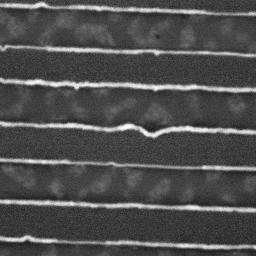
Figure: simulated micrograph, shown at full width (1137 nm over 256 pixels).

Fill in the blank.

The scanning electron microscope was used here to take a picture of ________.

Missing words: one or a few lines or trenches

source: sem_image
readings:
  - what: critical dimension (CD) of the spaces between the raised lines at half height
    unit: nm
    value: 175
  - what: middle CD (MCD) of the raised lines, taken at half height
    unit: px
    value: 39.4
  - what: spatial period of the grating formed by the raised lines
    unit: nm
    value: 346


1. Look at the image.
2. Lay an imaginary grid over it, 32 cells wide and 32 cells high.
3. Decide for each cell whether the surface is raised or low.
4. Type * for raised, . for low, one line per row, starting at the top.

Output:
********************************
......................**********
................................
................................
................................
................................
*******************.**..........
********************************
********************************
********************************
.....***************************
................................
................................
................................
................................
***.....*.......................
******************..************
********************************
********************************
********************************
............********************
................................
................................
................................
................................
***********.....................
********************************
********************************
********************************
********************************
.................***************
................................